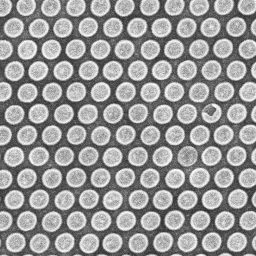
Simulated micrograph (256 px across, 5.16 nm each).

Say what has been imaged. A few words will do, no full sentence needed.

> a regular array of raised bodies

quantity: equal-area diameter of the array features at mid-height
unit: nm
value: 96.4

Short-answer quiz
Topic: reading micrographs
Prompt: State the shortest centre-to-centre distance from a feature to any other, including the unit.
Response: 124 nanometres